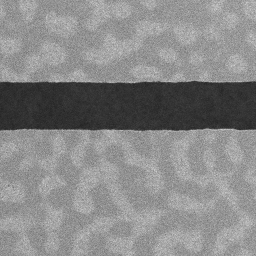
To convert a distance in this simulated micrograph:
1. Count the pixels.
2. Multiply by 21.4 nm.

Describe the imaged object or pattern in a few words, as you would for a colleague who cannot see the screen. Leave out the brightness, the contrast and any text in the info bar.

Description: one or a few lines or trenches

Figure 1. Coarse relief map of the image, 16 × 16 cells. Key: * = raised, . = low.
****************
****************
****************
****************
****************
................
................
................
****************
****************
****************
****************
****************
****************
****************
****************